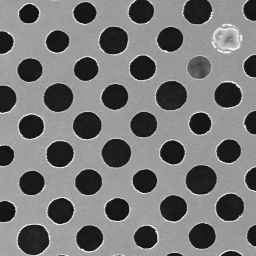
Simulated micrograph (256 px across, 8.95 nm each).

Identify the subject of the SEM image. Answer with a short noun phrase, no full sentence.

a regular array of holes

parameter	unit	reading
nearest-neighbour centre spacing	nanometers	355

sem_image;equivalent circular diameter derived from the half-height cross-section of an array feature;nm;233